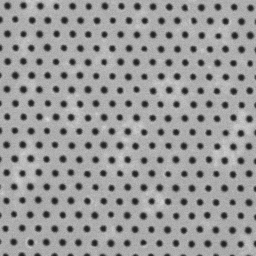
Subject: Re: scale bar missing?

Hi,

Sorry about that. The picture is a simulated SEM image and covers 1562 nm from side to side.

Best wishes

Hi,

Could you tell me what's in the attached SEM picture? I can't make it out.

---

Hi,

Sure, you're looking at a regular array of holes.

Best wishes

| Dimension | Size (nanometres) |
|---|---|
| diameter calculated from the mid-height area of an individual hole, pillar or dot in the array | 41.3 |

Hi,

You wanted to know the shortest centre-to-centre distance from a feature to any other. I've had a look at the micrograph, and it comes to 94.9 nm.